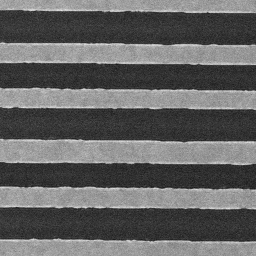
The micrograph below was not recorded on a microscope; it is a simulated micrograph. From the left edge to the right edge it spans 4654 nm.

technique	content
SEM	lines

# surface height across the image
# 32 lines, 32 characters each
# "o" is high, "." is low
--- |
oooooooooooooooooooooooooooooooo
.......................ooooooooo
................................
................................
................................
oooooooooooooooo................
oooooooooooooooooooooooooooooooo
oooooooooooooooooooooooooooooooo
................................
................................
................................
oooooooooooooooooooooooooooooooo
oooooooooooooooooooooooooooooooo
..................oo...ooooooooo
................................
................................
................................
................................
oooooooooooooooooooooooooooooooo
oooooooooooooooooooooooooooooooo
.............................ooo
................................
................................
ooo.oo.oo.oo....................
oooooooooooooooooooooooooooooooo
oooooooooooooooooooooooooooooooo
................................
................................
................................
................................
oooooooooooooooooooooooooooooooo
oooooooooooooooooooooooooooooooo